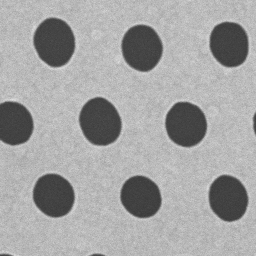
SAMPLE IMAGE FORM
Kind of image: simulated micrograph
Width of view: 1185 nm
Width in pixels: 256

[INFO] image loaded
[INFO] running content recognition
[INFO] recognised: a regular array of holes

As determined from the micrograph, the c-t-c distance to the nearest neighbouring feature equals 397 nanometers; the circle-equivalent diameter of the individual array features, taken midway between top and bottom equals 201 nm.